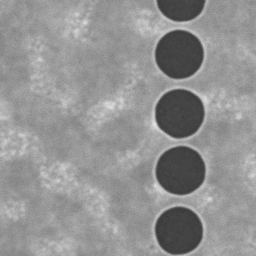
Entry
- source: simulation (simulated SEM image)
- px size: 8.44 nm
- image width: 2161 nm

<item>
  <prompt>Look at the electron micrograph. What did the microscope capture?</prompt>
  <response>holes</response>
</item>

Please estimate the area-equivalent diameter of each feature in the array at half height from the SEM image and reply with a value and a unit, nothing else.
418 nm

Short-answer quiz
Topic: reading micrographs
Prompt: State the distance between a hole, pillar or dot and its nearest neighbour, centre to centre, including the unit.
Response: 0.49 microns